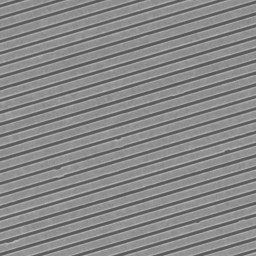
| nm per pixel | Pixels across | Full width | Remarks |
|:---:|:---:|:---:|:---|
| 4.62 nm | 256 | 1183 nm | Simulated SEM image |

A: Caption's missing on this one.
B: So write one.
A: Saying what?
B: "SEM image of parallel lines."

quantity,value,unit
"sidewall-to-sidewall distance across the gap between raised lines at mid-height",15.5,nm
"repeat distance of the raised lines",52.4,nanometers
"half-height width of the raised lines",34.9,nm